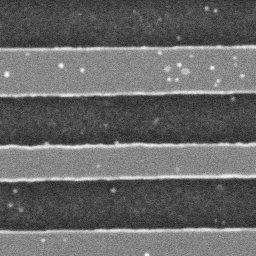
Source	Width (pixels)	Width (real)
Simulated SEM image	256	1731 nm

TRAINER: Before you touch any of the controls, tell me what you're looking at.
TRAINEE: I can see lines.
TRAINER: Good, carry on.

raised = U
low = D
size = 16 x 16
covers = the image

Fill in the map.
DDDDDDDDDDDDDDDD
DDDDDDDDDDDDDDDD
DDDDDDDDDDDDDDDD
UUUUUUUUUUUUUUUU
UUUUUUUUUUUUUUUU
UUUUUUUUUUUUUUUU
DDDDDDDDDDDDDDDD
DDDDDDDDDDDDDDDD
DDDDDDDDDDDDDDDD
UUUUUUUUUUUUUUUU
UUUUUUUUUUUUUUUU
DDDDDDDDDDDDDDDD
DDDDDDDDDDDDDDDD
DDDDDDDDDDDDDDDD
UUUUUUUUUUUUUUUU
UUUUUUUUUUUUUUUU